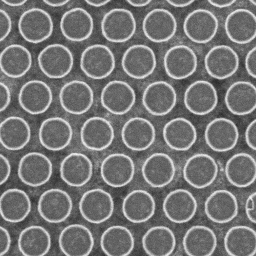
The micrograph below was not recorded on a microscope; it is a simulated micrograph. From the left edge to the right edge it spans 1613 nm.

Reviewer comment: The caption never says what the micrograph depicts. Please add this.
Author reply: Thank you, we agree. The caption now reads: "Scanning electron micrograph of a regular array of raised bodies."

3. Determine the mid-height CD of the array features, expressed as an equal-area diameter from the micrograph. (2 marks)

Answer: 31.9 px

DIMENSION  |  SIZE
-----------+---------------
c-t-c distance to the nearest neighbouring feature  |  259 nanometres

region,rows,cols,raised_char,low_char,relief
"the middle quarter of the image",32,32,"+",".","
++..++++++++...++++++++...++++++
+....+++++++...+++++++....++++++
......+++++.....+++++.....++++++
................................
................................
++++++.....+++++.....+++++......
+++++++...+++++++....++++++....+
+++++++...+++++++...++++++++..++
+++++++..++++++++...++++++++..++
+++++++...+++++++...++++++++..++
++++++....+++++++...+++++++....+
.++++......+++++.....+++++......
................................
................................
......+++++.....+++++......++++.
+....+++++++...+++++++....++++++
++...+++++++...+++++++...+++++++
++...+++++++...+++++++...+++++++
+....+++++++...+++++++...+++++++
+....+++++++...+++++++....++++++
.....++++++.....+++++......+++++
................................
................................
.+++++.....+++++.....+++++......
++++++....+++++++....++++++....+
+++++++...+++++++...+++++++....+
+++++++...+++++++...+++++++...++
+++++++...+++++++...+++++++...++
++++++....+++++++...+++++++...++
.++++......+++++.....+++++.....+
.......................+........
................................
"